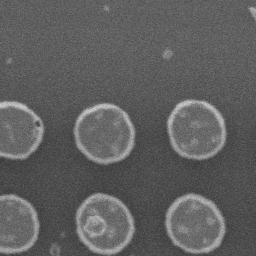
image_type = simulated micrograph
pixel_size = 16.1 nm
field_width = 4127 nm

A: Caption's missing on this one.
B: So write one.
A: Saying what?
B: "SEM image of raised bodies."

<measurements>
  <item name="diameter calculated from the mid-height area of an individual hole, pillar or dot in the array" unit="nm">898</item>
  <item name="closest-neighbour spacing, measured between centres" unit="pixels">90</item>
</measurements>